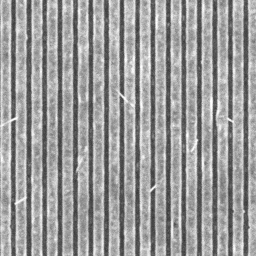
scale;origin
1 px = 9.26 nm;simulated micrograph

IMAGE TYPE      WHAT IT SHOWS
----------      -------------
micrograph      parallel lines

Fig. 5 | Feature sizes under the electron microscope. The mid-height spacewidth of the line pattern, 0.0475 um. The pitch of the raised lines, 0.143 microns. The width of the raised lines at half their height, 94.9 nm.